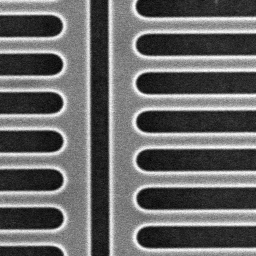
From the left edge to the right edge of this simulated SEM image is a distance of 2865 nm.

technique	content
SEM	groups of lines, slits or small figures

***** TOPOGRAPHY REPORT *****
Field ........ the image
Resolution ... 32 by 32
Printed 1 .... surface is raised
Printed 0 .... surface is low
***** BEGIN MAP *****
11111111111000111000000000000000
11111111111000111000000000000000
00000000111000111111111111111111
00000000111000111111111111111111
00000001111000111100000000000000
11111111111000111000000000000000
11111111111000111000000000000000
00000000111000111111111111111111
00000000111000111111111111111111
00000001111000111000000000000000
11111111111000111000000000000000
00000001111000111100000000000000
00000000111000111111111111111111
00000000111000111111111111111111
11111111111000111000000000000000
11111111111000111000000000000000
00000001111000111100000000000000
00000000111000111111111111111111
00000000111000111111111111111000
11111111111000111000000000000000
11111111111000111000000000000000
00000000111000111110011111111111
00000000111000111111111111111111
00000000111000111100000000000000
11111111111000111000000000000000
11111111111000111000000000000000
00000000111000111111111111111111
00000000111000111111111111111111
00000001111000111100000000000000
11111111111000111000000000000000
11111111111000111000000000000000
00000000111000111111111111111111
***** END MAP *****